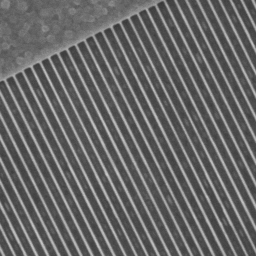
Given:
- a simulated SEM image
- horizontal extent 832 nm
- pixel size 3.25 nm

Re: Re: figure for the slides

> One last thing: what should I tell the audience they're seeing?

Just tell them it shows parallel lines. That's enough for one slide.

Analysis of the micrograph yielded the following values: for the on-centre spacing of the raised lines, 9.91 px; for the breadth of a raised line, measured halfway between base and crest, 6.5 nm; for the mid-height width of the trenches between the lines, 25.5 nanometers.